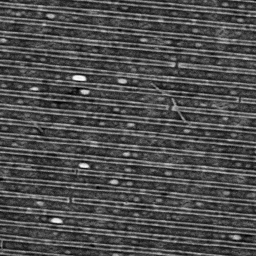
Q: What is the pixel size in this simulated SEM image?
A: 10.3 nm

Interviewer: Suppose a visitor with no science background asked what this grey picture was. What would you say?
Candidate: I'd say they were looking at parallel lines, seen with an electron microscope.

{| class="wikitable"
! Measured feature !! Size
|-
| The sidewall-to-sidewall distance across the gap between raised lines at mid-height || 0.105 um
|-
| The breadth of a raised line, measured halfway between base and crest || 47.2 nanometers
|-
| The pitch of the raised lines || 149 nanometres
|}